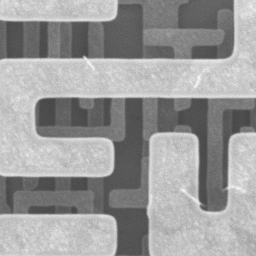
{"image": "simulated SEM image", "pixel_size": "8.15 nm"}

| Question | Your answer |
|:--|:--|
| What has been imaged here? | wiring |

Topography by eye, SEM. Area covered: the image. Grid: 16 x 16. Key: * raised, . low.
*******........*
...............*
...............*
..............**
****************
****************
**..............
**..............
***.......**...*
*******..***..**
*******..***..**
.........***..**
.........***..**
*******..*******
*******..*******
*******..*******